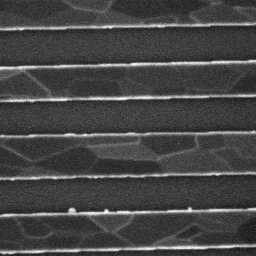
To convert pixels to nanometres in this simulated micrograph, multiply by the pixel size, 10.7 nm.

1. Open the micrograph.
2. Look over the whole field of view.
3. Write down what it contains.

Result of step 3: lines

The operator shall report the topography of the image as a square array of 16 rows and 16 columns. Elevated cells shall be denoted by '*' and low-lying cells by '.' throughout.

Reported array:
****************
****************
................
................
****************
****************
................
................
****************
****************
****************
................
................
****************
****************
*************...